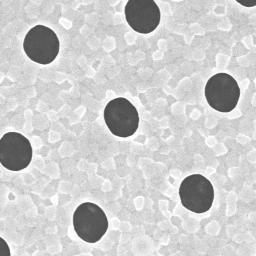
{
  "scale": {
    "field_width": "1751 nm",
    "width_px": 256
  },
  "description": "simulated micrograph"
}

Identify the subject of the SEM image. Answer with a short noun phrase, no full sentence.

holes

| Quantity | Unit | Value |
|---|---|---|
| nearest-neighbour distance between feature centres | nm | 714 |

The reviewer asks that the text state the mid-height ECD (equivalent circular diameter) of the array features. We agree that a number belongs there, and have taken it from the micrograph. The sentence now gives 258 nm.